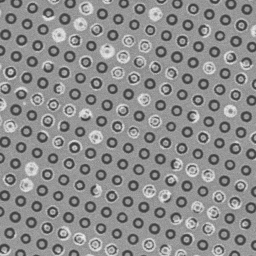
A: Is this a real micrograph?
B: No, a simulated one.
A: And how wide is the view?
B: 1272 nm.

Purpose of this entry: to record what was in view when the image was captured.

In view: a regular array of ring-shaped grooves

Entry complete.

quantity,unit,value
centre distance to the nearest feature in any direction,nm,82.9